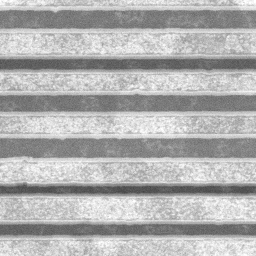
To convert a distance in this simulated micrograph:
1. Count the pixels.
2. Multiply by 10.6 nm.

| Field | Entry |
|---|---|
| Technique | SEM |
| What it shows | parallel lines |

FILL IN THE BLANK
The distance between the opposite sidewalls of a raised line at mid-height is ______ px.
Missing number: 23.9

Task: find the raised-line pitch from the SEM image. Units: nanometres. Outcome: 437